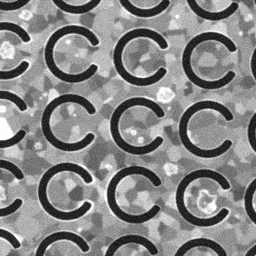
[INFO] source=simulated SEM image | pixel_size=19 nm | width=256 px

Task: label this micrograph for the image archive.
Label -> an array of small figures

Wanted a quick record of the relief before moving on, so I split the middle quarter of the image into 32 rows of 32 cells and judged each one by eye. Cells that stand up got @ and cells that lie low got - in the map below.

@@@@@@--@@@@@--@@@@@@@@@@@@@@@--
@@@@@---@@@@@---@@@@@@@---@@@@--
--------@@@@@@---@@@@@----@@@@--
-------@@@@@@@-----------@@@@@@-
@---@@@@@@@@@@@@--------@@@@@@@@
@@@@@@@@@@@@@@@@@@---@@@@@@@@@@@
@@@@@@@@@@@@@@@@@@@@@@@@@@@@@@@@
---@@@@@@@@@@@@@@@@@@@@@@@@@@@@@
-----@@@@@@@@@@@@----@@@@@@@@@@@
-------@@@@@@@@--------@@@@@@@@@
@@@@----@@@@@-----------@@@@@@@-
@@@@@---@@@@@---@@@@@@---@@@@@--
@@@@@@-@@@@@---@@@@@@@@--@@@@@--
@@@@@@@@@@@@--@@@@@@@@@@@@@@@---
@@@@@@@@@@@---@@@@@@@@@@@@@@@--@
@@@@@@@@@@@---@@@@@@@@@@@@@@@--@
@@@@@@@@@@@---@@@@@@@@@@@@@@@--@
@@@@@@-@@@@@--@@@@@@@@@@@@@@@--@
@@@@@---@@@@---@@@@@@@@--@@@@--@
@@@----@@@@@@---@@@@@@---@@@@---
------@@@@@@@-----------@@@@@@--
----@@@@@@@@@@---------@@@@@@@@-
@@@@@@@@@@@@@@@@@----@@@@@@@@@@@
@@@@@@@@@@@@@@@@@@@@@@@@@@@@@@@@
@@@@@@@@@@@@@@@@@@@@@@@@@@@@@@@@
-----@@@@@@@@@@@---@@@@@@@@@@@@@
------@@@@@@@@--------@@@@@@@@@@
@@@----@@@@@@----------@@@@@@@@-
@@@@---@@@@@---@@@@@@---@@@@@@--
@@@@@--@@@@---@@@@@@@@--@@@@@---
@@@@@@@@@@@--@@@@@@@@@@-@@@@---@
@@@@@@@@@@---@@@@@@@@@@@@@@@---@